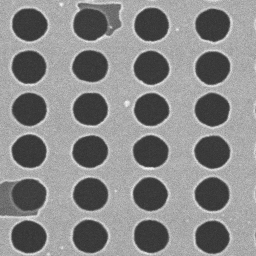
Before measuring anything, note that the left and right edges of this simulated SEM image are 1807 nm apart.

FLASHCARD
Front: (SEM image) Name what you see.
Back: a regular array of holes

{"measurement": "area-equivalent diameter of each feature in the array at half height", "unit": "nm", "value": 240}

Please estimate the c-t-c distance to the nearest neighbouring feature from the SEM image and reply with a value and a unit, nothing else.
297 nanometers